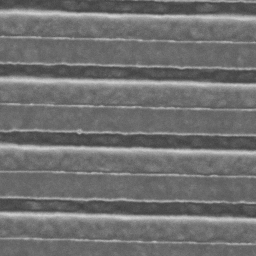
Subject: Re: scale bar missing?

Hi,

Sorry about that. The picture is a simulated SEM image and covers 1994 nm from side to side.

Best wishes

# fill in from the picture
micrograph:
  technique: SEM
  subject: lines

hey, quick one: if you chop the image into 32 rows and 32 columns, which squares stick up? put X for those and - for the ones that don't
--------------------------------
--------------------------------
XXXXXXXXXXXXXXXXXXXXXXXXXXXXXXXX
XXXXXXXXXXXXXXXXXXXXXXXXXXXXXXXX
XXXXXXXXXXXXXXXXXXXXXXXXXXXXXXXX
XXXXXXXXXXXXXXXXXXXXXXXXXXXXXXXX
XXXXXXXXXXXXXXXXXXXXXXXXXXXXXXXX
XXXXXXXXXXXXXXXXXXXXXXXXXXXXXXXX
----------------------------XXXX
--------------------------------
XXXXXXXXXXXXXXXXXXXXXXXXXXX-----
XXXXXXXXXXXXXXXXXXXXXXXXXXXXXXXX
XXXXXXXXXXXXXXXXXXXXXXXXXXXXXXXX
XXXXXXXXXXXXXXXXXXXXXXXXXXXXXXXX
XXXXXXXXXXXXXXXXXXXXXXXXXXXXXXXX
XXXXXXXXXXXXXXXXXXXXXXXXXXXXXXXX
---------XXXXXXXXXXXXXXXXXXXXXXX
--------------------------------
XXXXXXXXXXX---------------------
XXXXXXXXXXXXXXXXXXXXXXXXXXXXXXXX
XXXXXXXXXXXXXXXXXXXXXXXXXXXXXXXX
XXXXXXXXXXXXXXXXXXXXXXXXXXXXXXXX
XXXXXXXXXXXXXXXXXXXXXXXXXXXXXXXX
XXXXXXXXXXXXXXXXXXXXXXXXXXXXXXXX
XXXXXXXXXXXXXXXXXXXXXXXXXXXXXXXX
--------------------------------
--------------------------------
XXXXXXXXXXXXXXXXXXXXXXXXXXXXXXXX
XXXXXXXXXXXXXXXXXXXXXXXXXXXXXXXX
XXXXXXXXXXXXXXXXXXXXXXXXXXXXXXXX
XXXXXXXXXXXXXXXXXXXXXXXXXXXXXXXX
XXXXXXXXXXXXXXXXXXXXXXXXXXXXXXXX